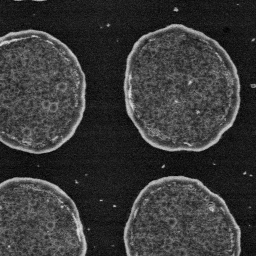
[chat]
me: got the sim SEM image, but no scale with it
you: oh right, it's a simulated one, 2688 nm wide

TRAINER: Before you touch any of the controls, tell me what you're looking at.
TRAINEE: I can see raised bodies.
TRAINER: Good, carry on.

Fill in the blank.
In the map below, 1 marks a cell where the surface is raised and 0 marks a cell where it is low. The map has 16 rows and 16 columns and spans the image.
0000000000000000
0000000000000000
1111000001111000
1111100011111100
1111100011111110
1111100011111110
1111100011111110
1111100011111110
1111000001111100
0010000000000000
0000000000000000
1110000000111000
1111000001111100
1111100011111100
1111100011111110
1111100011111110